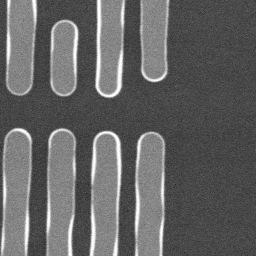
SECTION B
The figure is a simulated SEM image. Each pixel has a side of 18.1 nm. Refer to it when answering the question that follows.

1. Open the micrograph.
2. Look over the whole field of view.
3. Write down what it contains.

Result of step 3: groups of lines, slits or small figures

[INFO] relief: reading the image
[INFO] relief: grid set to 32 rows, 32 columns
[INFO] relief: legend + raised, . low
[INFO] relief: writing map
.+++........+++...+++...........
.+++........+++...+++...........
.+++........+++...+++...........
.+++...++...+++...+++...........
.+++...+++..+++...+++...........
.+++...++...+++...+++...........
.+++..+++...+++...+++...........
.+++..+++...+++...+++...........
.+++..+++...+++...+++...........
.+++..+++...+++...++............
.+++..+++...+++.................
.++....++...+++.................
................................
................................
................................
................................
.++....++.......................
.+++..+++...+++...++............
.+++..+++...+++..+++............
++++..+++...+++..+++............
++++..+++...+++..+++............
++++..+++...+++..+++............
.+++..+++...+++..+++............
.+++..+++...+++..+++............
.+++..+++...+++..+++............
.++...+++...+++..+++............
+++...+++...+++..+++............
+++...+++...+++..+++............
+++...+++...+++..+++............
+++...+++...+++..+++............
+++...+++...+++..+++............
+++...+++..+++...+++............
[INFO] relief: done